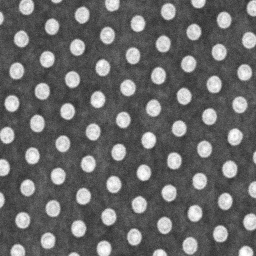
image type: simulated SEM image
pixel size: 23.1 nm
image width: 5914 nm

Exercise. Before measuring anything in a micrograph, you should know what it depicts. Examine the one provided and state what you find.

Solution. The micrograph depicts a regular array of raised bodies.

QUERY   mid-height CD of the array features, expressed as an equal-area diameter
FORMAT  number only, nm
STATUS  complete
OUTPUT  336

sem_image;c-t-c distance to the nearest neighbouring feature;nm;748